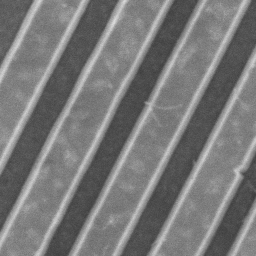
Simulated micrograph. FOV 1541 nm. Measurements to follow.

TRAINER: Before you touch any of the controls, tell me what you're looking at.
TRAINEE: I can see one or a few lines or trenches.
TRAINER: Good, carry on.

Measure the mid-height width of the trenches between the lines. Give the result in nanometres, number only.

179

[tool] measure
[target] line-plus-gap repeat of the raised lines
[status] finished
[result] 0.429 micrometres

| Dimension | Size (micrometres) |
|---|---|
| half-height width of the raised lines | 0.255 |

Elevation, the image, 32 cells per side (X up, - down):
----XXXXXXX----XXXXXX----XXXXXX-
----XXXXXX-----XXXXXX---XXXXXX--
---XXXXXX-----XXXXXX----XXXXXX--
---XXXXXX-----XXXXX----XXXXXX---
---XXXXX-----XXXXXX----XXXXXX---
--XXXXXX-----XXXXX----XXXXXX----
-XXXXXX-----XXXXXX----XXXXXX----
-XXXXXX----XXXXXX----XXXXXX----X
XXXXXX-----XXXXXX----XXXXXX----X
XXXXXX----XXXXXX----XXXXXX-----X
XXXXX-----XXXXXX----XXXXXX----XX
XXXXX----XXXXXX----XXXXXX----XXX
XXXX-----XXXXXX----XXXXX-----XXX
XXXX----XXXXXX----XXXXXX----XXXX
XXX-----XXXXXX----XXXXXX----XXXX
XXX----XXXXXX----XXXXXX----XXXXX
XX-----XXXXXX----XXXXXX----XXXXX
XX----XXXXXX----XXXXXX----XXXXXX
X-----XXXXXX----XXXXX-----XXXXXX
X----XXXXXX----XXXXXX----XXXXXX-
-----XXXXXX----XXXXX-----XXXXXX-
----XXXXXX----XXXXXX----XXXXXX--
----XXXXXX----XXXXX-----XXXXXX--
---XXXXXX----XXXXXX----XXXXXX---
---XXXXXX----XXXXX-----XXXXXX---
--XXXXXX----XXXXXX----XXXXXX----
--XXXXXX----XXXXX-----XXXXXX----
-XXXXXX----XXXXXX----XXXXXX----X
-XXXXXX----XXXXX-----XXXXXX----X
XXXXXX----XXXXXX----XXXXXX----XX
XXXXXX----XXXXX----XXXXXXX----XX
XXXXX----XXXXXX----XXXXXX----XXX